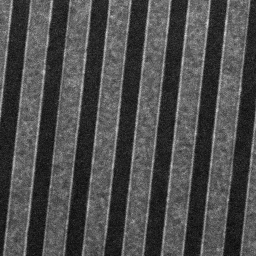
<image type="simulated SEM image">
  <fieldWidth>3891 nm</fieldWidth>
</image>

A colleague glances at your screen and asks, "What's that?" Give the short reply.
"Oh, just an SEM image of parallel lines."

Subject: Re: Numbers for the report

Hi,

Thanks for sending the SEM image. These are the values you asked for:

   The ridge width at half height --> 0.306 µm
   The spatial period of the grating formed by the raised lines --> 598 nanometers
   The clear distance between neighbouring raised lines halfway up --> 291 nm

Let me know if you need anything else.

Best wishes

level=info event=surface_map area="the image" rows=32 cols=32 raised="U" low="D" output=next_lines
UDDDUUDDDUUDDDUUDDDUUDDDUUDDDUUD
UDDDUUDDDUUDDDUUDDDUUDDUUUDDDUUD
UDDDUUDDDUUDDDUUDDUUUDDUUUDDUUUD
UDDDUUDDUUUDDUUUDDUUUDDUUUDDUUUD
UDDUUUDDUUUDDUUUDDUUUDDUUUDDUUUD
UDDUUUDDUUUDDUUUDDUUUDDUUUDDUUUD
UDDUUUDDUUUDDUUUDDUUUDDUUUDDUUDD
UDDUUUDDUUUDDUUDDDUUUDDUUDDDUUDD
UDDUUUDDUUDDDUUDDDUUDDDUUDDDUUDD
DDDUUDDDUUDDDUUDDDUUDDDUUDDDUUDD
DDDUUDDDUUDDDUUDDDUUDDDUUDDUUUDD
DDDUUDDDUUDDDUUDDUUUDDUUUDDUUUDD
DDDUUDDDUUDDUUUDDUUUDDUUUDDUUUDD
DDUUUDDUUUDDUUUDDUUUDDUUUDDUUUDD
DDUUUDDUUUDDUUUDDUUUDDUUUDDUUUDD
DDUUUDDUUUDDUUUDDUUUDDUUUDDUUDDD
DDUUUDDUUUDDUUUDDUUUDDUUDDDUUDDD
DDUUUDDUUDDDUUUDDUUDDDUUDDDUUDDD
DDUUDDDUUDDDUUDDDUUDDDUUDDDUUDDD
DDUUDDDUUDDDUUDDDUUDDDUUDDDUUDDD
DDUUDDDUUDDDUUDDDUUDDUUUDDUUUDDU
DDUUDDDUUDDUUUDDUUUDDUUUDDUUUDDU
DDUUDDUUUDDUUUDDUUUDDUUUDDUUUDDU
DUUUDDUUUDDUUUDDUUUDDUUUDDUUUDDU
DUUUDDUUUDDUUUDDUUUDDUUUDDUUUDDU
DUUUDDUUUDDUUUDDUUUDDUUDDDUUDDDU
DUUUDDUUDDDUUUDDUUDDDUUDDDUUDDDU
DUUDDDUUDDDUUDDDUUDDDUUDDDUUDDDU
DUUDDDUUDDDUUDDDUUDDDUUDDDUUDDDU
DUUDDDUUDDDUUDDDUUDDUUUDDDUUDDUU
DUUDDDUUDDDUUDDUUUDDUUUDDUUUDDUU
DUUDDUUUDDUUUDDUUUDDUUUDDUUUDDUU